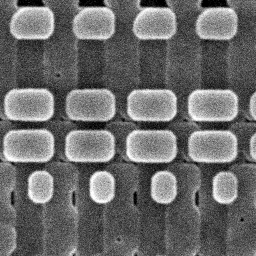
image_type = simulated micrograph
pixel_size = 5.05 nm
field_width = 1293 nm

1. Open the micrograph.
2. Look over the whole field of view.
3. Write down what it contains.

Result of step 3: wiring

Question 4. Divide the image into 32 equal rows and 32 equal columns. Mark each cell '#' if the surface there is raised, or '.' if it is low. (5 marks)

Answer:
................................
..####....####....###.....###...
..#####..#####...#####...#####..
.######..#####...#####...#####..
..####....####...####....####...
................................
................................
................................
................................
................................
................................
.#####...#####...####...#####...
.######.######..######..######.#
.######.######..######..######.#
.#####...#####..######..#####...
................................
.#####...####....####...........
.######.######..######..######.#
.######.######..######..######.#
.#####..######..######..#####...
................................
....##..........................
....##.....###.....###.....###..
....##.....###.....###.....###..
....##......##.....###.....###..
................................
................................
................................
................................
................................
................................
................................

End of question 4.